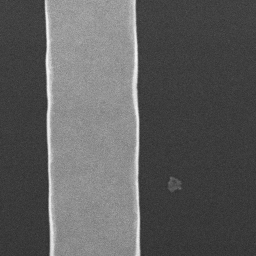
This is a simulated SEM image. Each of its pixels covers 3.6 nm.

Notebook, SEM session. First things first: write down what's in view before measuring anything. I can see wiring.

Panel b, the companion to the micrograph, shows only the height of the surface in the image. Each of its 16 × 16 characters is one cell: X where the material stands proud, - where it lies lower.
---XXXXX--------
---XXXXX--------
---XXXXX--------
---XXXXX--------
---XXXXX--------
---XXXXX--------
---XXXXX--------
---XXXXXX-------
---XXXXXX-------
---XXXXXX-------
---XXXXXX-------
---XXXXXX-------
---XXXXXX-------
---XXXXXX-------
---XXXXXX-------
---XXXXXX-------